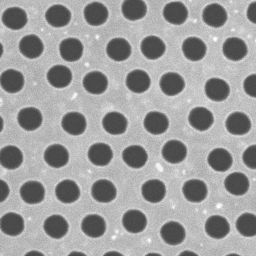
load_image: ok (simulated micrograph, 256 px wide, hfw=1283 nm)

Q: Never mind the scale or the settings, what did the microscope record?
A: a regular array of holes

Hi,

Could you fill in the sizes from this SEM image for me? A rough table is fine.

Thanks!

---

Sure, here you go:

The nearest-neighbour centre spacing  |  180 nanometres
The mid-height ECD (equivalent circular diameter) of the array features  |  116 nm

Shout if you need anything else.